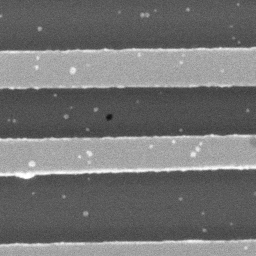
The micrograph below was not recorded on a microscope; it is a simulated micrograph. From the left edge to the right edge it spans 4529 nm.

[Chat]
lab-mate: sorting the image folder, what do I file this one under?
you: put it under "lines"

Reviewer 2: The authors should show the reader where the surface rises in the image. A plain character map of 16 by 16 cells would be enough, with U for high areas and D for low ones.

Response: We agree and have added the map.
DDDDDDDDDDDDDDDD
DDDDDDDDDDDDDDDD
DDDDDDDDDDDDDDDD
UUUUUUUUUUUUUUUU
UUUUUUUUUUUUUUUU
UUUDDDDDDDDDDDDD
DDDDDDDDDDDDDDDD
DDDDDDDDDDDDDDDD
DDDDDDDDDDDDUUUU
UUUUUUUUUUUUUUUU
UUUUUUUUUUUUUUUU
DDDDDDDDDDDDDDDD
DDDDDDDDDDDDDDDD
DDDDDDDDDDDDDDDD
DDDDDDDDDDDDDDDD
UUUUUUUUUUUUUUUU